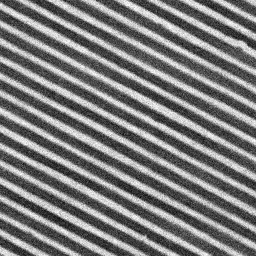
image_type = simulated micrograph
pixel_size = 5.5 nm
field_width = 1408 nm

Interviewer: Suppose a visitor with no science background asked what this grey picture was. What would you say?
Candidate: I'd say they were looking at parallel lines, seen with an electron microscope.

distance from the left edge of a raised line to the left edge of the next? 84.7 nm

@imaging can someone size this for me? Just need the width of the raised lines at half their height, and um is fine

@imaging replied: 0.0322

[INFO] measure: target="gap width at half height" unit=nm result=52.8